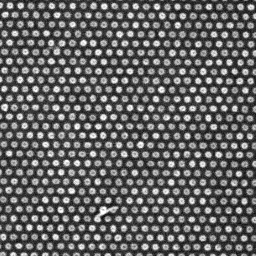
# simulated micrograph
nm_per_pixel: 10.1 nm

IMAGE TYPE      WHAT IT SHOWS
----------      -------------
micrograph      a regular array of raised bodies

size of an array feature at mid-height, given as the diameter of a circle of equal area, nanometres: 55.6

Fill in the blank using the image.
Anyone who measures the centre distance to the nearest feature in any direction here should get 10.1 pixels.